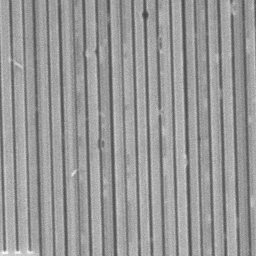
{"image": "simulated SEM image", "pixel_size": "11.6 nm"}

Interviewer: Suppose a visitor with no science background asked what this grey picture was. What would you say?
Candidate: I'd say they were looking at parallel lines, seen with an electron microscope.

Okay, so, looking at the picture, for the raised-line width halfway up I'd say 0.0581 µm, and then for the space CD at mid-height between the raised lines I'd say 81.3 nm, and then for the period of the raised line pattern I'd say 0.142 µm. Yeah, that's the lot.